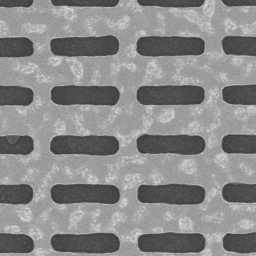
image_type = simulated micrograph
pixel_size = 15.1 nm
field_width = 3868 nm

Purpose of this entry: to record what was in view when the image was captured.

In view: a regular array of holes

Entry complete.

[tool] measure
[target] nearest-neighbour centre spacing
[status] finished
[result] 0.739 um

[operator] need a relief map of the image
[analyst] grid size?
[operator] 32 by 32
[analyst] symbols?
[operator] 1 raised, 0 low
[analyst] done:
00001110000000011000000001110000
11111111111111111111111111111111
11111111111111111111111111111111
11111111111111111111111111111111
11111111111110111111101111110011
00001100000000011000000000110000
00001100000000011000000001110000
11111111111111111111111111111111
11111111111111111111111111111111
11111111111111111111111111111111
11111111111111111111111111111111
00001100000000011000000000110000
00001110000000011000000001110000
11111111111111111111111111111111
11111111111111111111111111111111
11111111111111111111111111111111
11111111111111111111111111111111
00001110000000011000000001110000
00001100000000011000000000110000
11111111111111111111111111111111
11111111111111111111111111111111
11111111111111111111111111111111
11111111111111111111111111111111
00001100000000011000000001110000
00001100000000011000000000110000
10011111111111111111100001111111
11111111111111111111111111111111
11111111111111111111111111111111
11111111111111111111111111111111
00001110000000011100000001110000
00001100000000011000000000110000
00001111000000111100000001111000